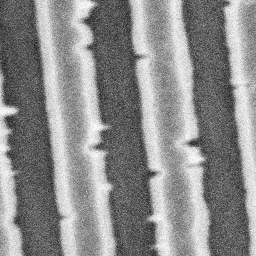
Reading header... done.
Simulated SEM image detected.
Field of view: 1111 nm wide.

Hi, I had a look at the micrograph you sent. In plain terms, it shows one or a few lines or trenches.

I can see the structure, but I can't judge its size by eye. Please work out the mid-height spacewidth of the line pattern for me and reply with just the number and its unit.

52 pixels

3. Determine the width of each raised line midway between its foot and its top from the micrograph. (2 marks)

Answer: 178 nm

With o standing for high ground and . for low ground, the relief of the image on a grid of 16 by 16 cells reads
...oo...ooo...oo
...oo....oo...oo
...oo....oo....o
...oo....oo....o
...ooo...ooo...o
...ooo...ooo...o
...ooo...ooo...o
...ooo...ooo...o
....oo...ooo...o
....oo....oo...o
....oo....oo....
....oo....oo....
o...oo....oo....
o...ooo...ooo...
o...ooo...ooo...
o...ooo...ooo...